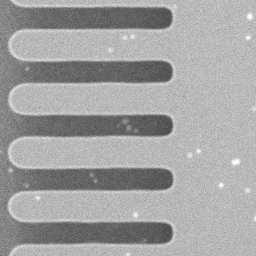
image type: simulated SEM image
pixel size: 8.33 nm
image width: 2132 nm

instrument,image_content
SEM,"groups of lines, slits or small figures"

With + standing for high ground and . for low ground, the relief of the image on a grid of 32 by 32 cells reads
..++++++++++++++++++++++++++++++
.....................+++++++++++
......................++++++++++
.....................+++++++++++
..++++++++++++++++++++++++++++++
.+++++++++++++++++++++++++++++++
.+++++++++++++++++++++++++++++++
...+++++++++++++++..++++++++++++
......................++++++++++
......................++++++++++
.....++++.++++++++++++++++++++++
.+++++++++++++++++++++++++++++++
.+++++++++++++++++++++++++++++++
..++++++++++++++++++++++++++++++
.....................+++++++++++
......................++++++++++
.....................+++++++++++
..++++++++++++++++++++++++++++++
.+++++++++++++++++++++++++++++++
.+++++++++++++++++++++++++++++++
..++++++++++++++++++++++++++++++
.....................+++++++++++
......................++++++++++
.....................+++++++++++
..++++++++++++++++++++++++++++++
.+++++++++++++++++++++++++++++++
.+++++++++++++++++++++++++++++++
..++++++++++++++++++++++++++++++
......................++++++++++
......................++++++++++
..........+++.......++++++++++++
..++++++++++++++++++++++++++++++